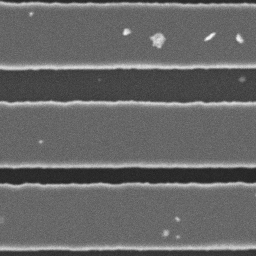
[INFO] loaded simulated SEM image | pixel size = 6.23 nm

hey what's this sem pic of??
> lines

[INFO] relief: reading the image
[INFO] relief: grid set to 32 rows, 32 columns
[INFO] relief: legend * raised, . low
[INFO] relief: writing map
********************************
********************************
********************************
********************************
********************************
********************************
********************************
********************************
*******************.*****.......
................................
................................
................................
................................
********************************
********************************
********************************
********************************
********************************
********************************
********************************
********************************
................................
................................
********************************
********************************
********************************
********************************
********************************
********************************
********************************
********************************
................................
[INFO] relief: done